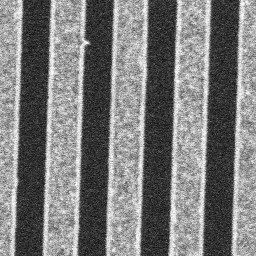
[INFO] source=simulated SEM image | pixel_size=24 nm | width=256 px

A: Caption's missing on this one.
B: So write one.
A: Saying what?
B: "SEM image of parallel lines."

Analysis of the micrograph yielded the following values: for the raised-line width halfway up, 721 nm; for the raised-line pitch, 1.51 micrometres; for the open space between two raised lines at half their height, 771 nm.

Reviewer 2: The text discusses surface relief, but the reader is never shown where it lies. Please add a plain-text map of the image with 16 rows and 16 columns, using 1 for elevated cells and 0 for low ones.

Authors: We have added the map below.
1001100110011001
1001100110011001
1001100110011001
1001100110011001
1001100110011001
1001100110011001
1001100110011001
1001100110011001
1001100110011001
1001100110011001
1001100110011001
1001100110011001
1001100110011001
1001100110011001
1001100110011001
1001100110011001